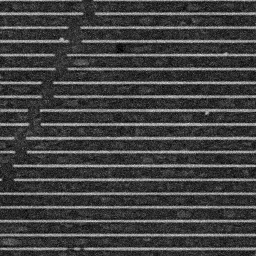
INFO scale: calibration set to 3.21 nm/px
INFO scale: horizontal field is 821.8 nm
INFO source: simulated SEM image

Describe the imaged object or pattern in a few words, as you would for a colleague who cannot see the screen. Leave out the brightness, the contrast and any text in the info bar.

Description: parallel lines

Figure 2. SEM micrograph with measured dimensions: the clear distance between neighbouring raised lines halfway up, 35.8 nanometres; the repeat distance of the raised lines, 0.0444 micrometres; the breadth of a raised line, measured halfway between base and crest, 0.0088 micrometres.